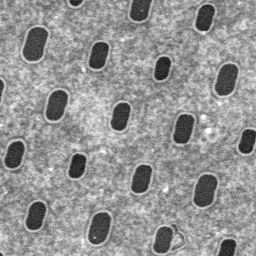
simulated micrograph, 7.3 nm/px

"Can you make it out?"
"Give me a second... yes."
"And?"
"a regular array of holes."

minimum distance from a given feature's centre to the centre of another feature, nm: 470